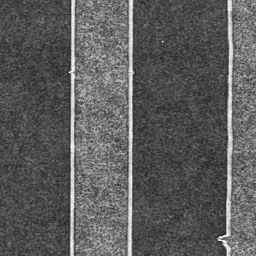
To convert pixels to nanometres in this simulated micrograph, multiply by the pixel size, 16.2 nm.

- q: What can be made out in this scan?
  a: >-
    one or a few lines or trenches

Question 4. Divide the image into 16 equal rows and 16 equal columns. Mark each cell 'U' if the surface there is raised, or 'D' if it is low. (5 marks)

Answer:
DDDDDUUUDDDDDDUU
DDDDDUUUDDDDDDUU
DDDDDUUUDDDDDDUU
DDDDDUUUDDDDDDUU
DDDDUUUUDDDDDDUU
DDDDDUUUDDDDDDUU
DDDDDUUUDDDDDDUU
DDDDDUUUDDDDDDUU
DDDDDUUUDDDDDDUU
DDDDDUUUDDDDDDUU
DDDDDUUUDDDDDDUU
DDDDDUUUDDDDDDUU
DDDDDUUUDDDDDDUU
DDDDDUUUDDDDDDUU
DDDDUUUUDDDDDDUU
DDDDUUUUDDDDDDUU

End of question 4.